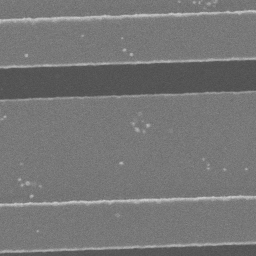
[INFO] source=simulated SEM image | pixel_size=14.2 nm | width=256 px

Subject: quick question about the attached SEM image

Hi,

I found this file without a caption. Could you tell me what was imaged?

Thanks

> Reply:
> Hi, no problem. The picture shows lines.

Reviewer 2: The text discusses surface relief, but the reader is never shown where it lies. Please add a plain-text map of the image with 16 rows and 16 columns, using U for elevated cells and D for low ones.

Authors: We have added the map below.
UUUUUUUUUUUUUUUU
UUUUUUUUUUUUUUUU
UUUUUUUUUUUUUUUU
UUUUUUUUUUUUUUUU
DDDDDDDDDDDDDDDD
DDDDDDDDDDDDDDDD
UUUUUUUUUUUUUUUU
UUUUUUUUUUUUUUUU
UUUUUUUUUUUUUUUU
UUUUUUUUUUUUUUUU
UUUUUUUUUUUUUUUU
UUUUUUUUUUUUUUUU
UUUUUUUUUUUUUUUU
UUUUUUUUUUUUUUUU
UUUUUUUUUUUUUUUU
UUUUUUUUUDDDDDDD